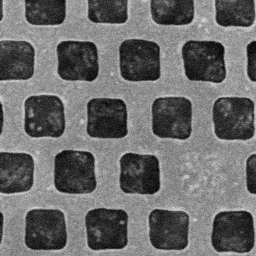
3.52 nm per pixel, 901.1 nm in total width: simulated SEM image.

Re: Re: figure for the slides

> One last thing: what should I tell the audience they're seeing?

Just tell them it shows a regular array of holes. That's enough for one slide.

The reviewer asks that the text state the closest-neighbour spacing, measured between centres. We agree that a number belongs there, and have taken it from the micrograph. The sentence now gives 0.219 µm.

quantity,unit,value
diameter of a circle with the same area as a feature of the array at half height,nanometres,159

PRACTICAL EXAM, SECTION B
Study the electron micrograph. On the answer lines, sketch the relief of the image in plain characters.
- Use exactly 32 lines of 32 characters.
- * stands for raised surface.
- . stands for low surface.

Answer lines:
***.....***.....***.....***.....
***.....***.....***.....***.....
***.....***.....***.....***.....
********************************
********************************
....***.....***.....***.....***.
....***.....***.....***.....***.
....***.....***.....***.....***.
....***.....***.....***.....***.
....***.....***.....***.....***.
********************************
********************************
***.....***....****.....***....*
***.....***.....***.....***.....
***.....***.....***.....***.....
***.....***.....***.....***.....
***.....***.....***.....***.....
****************************...*
********************************
....***.....***....************.
....***.....***.....***********.
....***.....***.....***********.
....***.....***.....***********.
....***.....***.....***********.
********************************
********************************
***.....***.....***....*****...*
.**.....***.....***.....***.....
.**.....***.....***.....**......
***.....***.....***.....**......
***.....***.....***....***......
****************************...*